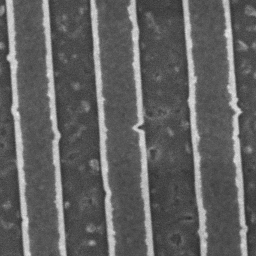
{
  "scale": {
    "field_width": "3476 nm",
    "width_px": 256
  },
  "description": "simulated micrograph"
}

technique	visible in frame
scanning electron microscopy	one or a few lines or trenches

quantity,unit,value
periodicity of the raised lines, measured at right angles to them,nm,1210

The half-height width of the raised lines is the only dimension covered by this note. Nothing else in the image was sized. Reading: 538 nanometers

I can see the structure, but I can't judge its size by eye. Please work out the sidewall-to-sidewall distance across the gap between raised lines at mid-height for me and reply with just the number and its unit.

670 nanometers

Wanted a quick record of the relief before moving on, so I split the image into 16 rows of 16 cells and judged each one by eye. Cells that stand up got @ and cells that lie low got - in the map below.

-@@---@@----@@--
-@@---@@----@@--
-@@---@@----@@--
-@@---@@@---@@--
-@@---@@@---@@--
-@@---@@@---@@@-
-@@---@@@---@@@-
-@@---@@@---@@@-
-@@@--@@@---@@@-
-@@@--@@@---@@@-
-@@@--@@@---@@@-
-@@@---@@---@@@-
-@@@---@@---@@@-
--@@---@@----@@-
--@@---@@----@@-
--@@---@@----@@-